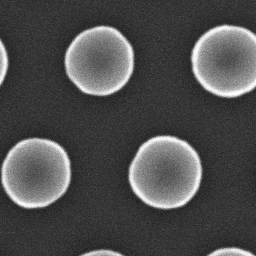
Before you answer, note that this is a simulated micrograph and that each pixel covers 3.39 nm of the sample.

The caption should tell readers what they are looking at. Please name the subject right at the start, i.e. raised bodies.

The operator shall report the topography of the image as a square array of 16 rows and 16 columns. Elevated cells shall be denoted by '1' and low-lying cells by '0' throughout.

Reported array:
0000000000000000
0000000000000000
0000011100000111
0000111100001111
0000111100001111
0000011000000111
0000000000000000
0000000000000000
0000000000000000
0111000001110000
1111000011111000
1111000011110000
0110000001110000
0000000000000000
0000000000000000
0000000000000000